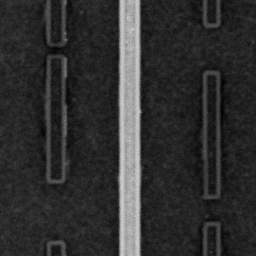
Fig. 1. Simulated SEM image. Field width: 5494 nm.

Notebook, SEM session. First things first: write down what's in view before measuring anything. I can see one or a few lines or trenches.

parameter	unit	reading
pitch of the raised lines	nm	1670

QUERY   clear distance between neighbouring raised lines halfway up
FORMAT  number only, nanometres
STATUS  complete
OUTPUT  1260